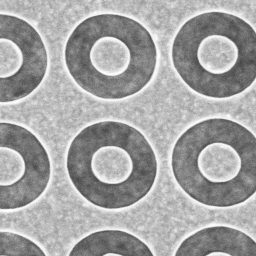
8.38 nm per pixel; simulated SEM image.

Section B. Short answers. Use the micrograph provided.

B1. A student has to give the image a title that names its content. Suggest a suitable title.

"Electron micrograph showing ring-shaped grooves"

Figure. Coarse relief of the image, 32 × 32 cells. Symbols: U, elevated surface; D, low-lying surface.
UUUUUUUUUUUUUUUUUUUUUUUUUUUUUUUU
UUUUUUUUUUUUUUUUUUUUUUUUUUDDUUUU
DDDUUUUUUUUDDDDDDUUUUUUUDDDDDDUU
DDDDUUUUUDDDDDDDDDUUUUUDDDDDDDDD
DDDDDUUUUDDDDDDDDDDUUUDDDDUDDDDD
UUDDDUUUDDDDUUUUDDDUUUDDDUUUUDDD
UUUDDDUUDDDUUUUUDDDDUDDDDUUUUUDD
UUUDDDUUDDDUUUUUDDDDUUDDDUUUUUDD
UUDDDDUUDDDDUUUUDDDUUUDDDDUUUDDD
UDDDDDUUUDDDDDDDDDDUUUUDDDDDDDDD
DDDDDUUUUUDDDDDDDDUUUUUDDDDDDDDU
DDDDUUUUUUUDDDDDDUUUUUUUUDDDDDUU
DDUUUUUUUUUUUUUUUUUUUUUUUUUUUUUU
UUUUUUUUUUUUUUUUUUUUUUUUUUUUUUUU
UUUUUUUUUUUUUUUUUUUUUUUUUUUUUUUU
DDUUUUUUUUUUDDDDUUUUUUUUDDDDDDUU
DDDDUUUUUUDDDDDDDUUUUUUDDDDDDDDU
DDDDDUUUUDDDDDDDDDUUUUDDDDDDDDDD
DDDDDDUUUDDDDUUDDDDUUUDDDDUUUDDD
UUUDDDUUDDDDUUUUDDDUUDDDDUUUUUDD
UUUDDDUUDDDUUUUUDDDDUDDDDUUUUUDD
UUUDDDUUDDDDUUUUDDDDUUDDDUUUUUDD
UUDDDDUUUDDDDUUUDDDUUUDDDDUUUDDD
DDDDDDUUUUDDDDDDDDDUUUUDDDDDDDDD
DDDDDUUUUUDDDDDDDDUUUUUUDDDDDDDU
DDDDUUUUUUUUDDDDDUUUUUUUUDDDDDUU
UUUUUUUUUUUUUUUUUUUUUUUUUUUUUUUU
UUUUUUUUUUUUUUUUUUUUUUUUUUUUUUUU
UUUUUUUUUUUUUUUUUUUUUUUUUUDDDUUU
DDDUUUUUUUUDDDDDDUUUUUUUDDDDDDDU
DDDDUUUUUUDDDDDDDDUUUUUDDDDDDDDD
DDDDDUUUUDDDDDDDDDDUUUDDDDDDDDDD